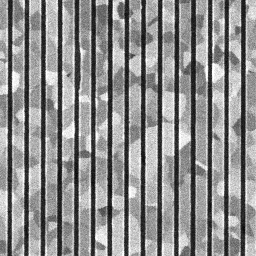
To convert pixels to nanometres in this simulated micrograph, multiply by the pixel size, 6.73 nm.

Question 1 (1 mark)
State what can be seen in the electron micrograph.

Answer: parallel lines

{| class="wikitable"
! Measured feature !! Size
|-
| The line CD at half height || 0.0774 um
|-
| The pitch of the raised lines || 112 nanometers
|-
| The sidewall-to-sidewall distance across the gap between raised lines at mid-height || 36.2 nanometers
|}